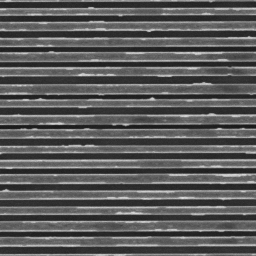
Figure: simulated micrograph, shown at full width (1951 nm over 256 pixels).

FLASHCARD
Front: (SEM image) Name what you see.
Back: parallel lines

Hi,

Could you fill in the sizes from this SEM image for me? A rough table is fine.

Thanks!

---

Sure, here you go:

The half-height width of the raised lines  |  69.6 nm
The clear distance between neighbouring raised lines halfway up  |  48.6 nanometres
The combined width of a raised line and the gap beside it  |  117 nanometres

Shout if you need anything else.